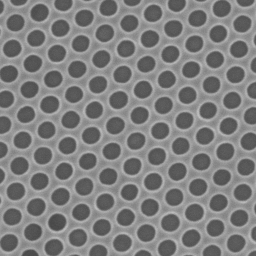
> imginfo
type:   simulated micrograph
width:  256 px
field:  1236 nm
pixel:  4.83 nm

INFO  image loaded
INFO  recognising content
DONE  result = a regular array of holes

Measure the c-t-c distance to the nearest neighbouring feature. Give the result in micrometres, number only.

0.123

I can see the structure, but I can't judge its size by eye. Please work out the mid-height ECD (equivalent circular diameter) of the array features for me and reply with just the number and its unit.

87.3 nanometers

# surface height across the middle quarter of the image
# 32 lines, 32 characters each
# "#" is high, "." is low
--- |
#.....##...###..##.....#######..
#.....#######....##...#######...
#....#######.....#######...###..
#######...##.....######.....###.
######.....##...###..##.....####
##.###.....#######....##...#####
#...##....#######.....#######...
.....#######....##....#######...
.....######.....##..####..###...
#..####..##.....#######....##...
######....##...########....#####
#####.....#######....##....#####
...##.....#######....###.####...
....##...###..###....#######....
....#######....##...####.###....
...#######.....#######....##....
#####....##....#######....######
####.....###.####...##....######
..##.....#######....###..####.##
...##...########....#######....#
...#######....##....#######.....
...#######....###.####...##....#
.####..###....#######....###..##
####....##...####.###....#######
####....#######....##....#######
..##....#######....########...##
..########...##....#######.....#
..#######....###..###...##.....#
.####.###....#######....###...##
###....##....#######.....#######
###....########...##....#######.
.##....#######.....##..###...##.